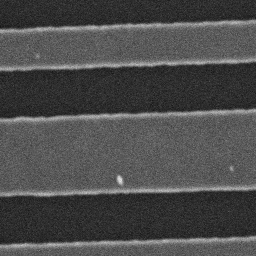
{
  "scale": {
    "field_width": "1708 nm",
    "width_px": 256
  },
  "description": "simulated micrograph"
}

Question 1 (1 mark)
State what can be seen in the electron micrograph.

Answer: lines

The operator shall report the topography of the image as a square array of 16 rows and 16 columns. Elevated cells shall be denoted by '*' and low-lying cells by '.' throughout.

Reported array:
................
..........******
****************
****************
................
................
................
****************
****************
****************
****************
****************
................
................
................
****************